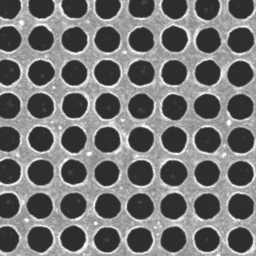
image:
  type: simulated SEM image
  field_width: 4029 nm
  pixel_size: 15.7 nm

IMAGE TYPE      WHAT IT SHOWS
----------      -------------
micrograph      a regular array of holes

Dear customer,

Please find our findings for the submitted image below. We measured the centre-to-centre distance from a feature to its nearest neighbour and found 518 nm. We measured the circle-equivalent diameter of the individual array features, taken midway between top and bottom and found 0.416 micrometres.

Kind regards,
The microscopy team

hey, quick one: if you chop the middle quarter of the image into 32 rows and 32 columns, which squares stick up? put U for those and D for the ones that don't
DDDDDUUUDDDDDDUUUDDDDDUUUDDDDDUU
DDDDDDUUDDDDDDUUDDDDDDDUDDDDDDDU
DDDDDDUDDDDDDDUUDDDDDDDUDDDDDDDU
DDDDDDUUDDDDDDUUDDDDDDUUDDDDDDDU
DDDDDUUUDDDDDUUUUDDDDDUUUDDDDDUU
UUDUUUUUUUUUUUUUUUUUUUUUUUUDUUUU
UUUUUUUUUUUUUUUUUUUUUUUUUUUUUUUU
UDDDUUUUUDDDUUUUUUDDDUUUUUDDUUUU
DDDDDDUUDDDDDUUUUDDDDDUUUDDDDDUU
DDDDDDUUDDDDDDUUDDDDDDDUUDDDDDDU
DDDDDDUUDDDDDDUUDDDDDDDUDDDDDDDU
DDDDDDUUDDDDDDUUDDDDDDUUDDDDDDDU
DDDDDUUUDDDDDDUUDDDDDDUUUDDDDDUU
UUDDUUUUUDDDUUUUUUDDDUUUUUDDDUUU
UUUUUUUUUUUUUUUUUUUUUUUUUUUUUUUU
UUDDUUUUUUUUUUUUUUUUUUUUUUUUUUUU
DDDDDUUUUDDDDUUUUDDDDDUUUDDDDDUU
DDDDDUUUDDDDDDUUDDDDDDUUUDDDDDDU
DDDDDDUDDDDDDDUUDDDDDDDUDDDDDDDU
DDDDDDUDDDDDDDUUDDDDDDUUDDDDDDDU
DDDDDUUUDDDDDDUUDDDDDDUUUDDDDDUU
DDDDUUUUUDDDDUUUUUDDDUUUUUDDDDUU
UUUUUUUUUUUUUUUUUUUUUUUUUUUUUUUU
UUUUUUUUUUUUUUUUUUUUUUUUUUUUUUUU
DDDDUUUUUDDDUUUUUDDDDUUUUUDDDUUU
DDDDDUUUDDDDDUUUDDDDDDUUUDDDDDUU
DDDDDDUUDDDDDDUUDDDDDDUUDDDDDDDU
DDDDDDUUDDDDDDUUDDDDDDDUDDDDDDDU
DDDDDUUUDDDDDDUUDDDDDDUUDDDDDDDU
DDDDDUUUDDDDDUUUUDDDDDUUUDDDDDUU
UUUUUUUUUUDDUUUUUUUDUUUUUUUDDUUU
UUUUUUUUUUUUUUUUUUUUUUUUUUUUUUUU